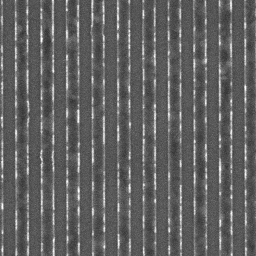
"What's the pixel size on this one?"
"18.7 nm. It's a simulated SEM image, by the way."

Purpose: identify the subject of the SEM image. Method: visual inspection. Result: parallel lines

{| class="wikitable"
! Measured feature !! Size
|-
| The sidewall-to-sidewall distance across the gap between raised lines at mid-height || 12.8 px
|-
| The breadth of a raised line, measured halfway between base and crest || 238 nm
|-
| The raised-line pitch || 475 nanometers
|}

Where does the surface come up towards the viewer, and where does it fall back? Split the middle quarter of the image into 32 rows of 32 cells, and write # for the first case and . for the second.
.###...###....##....###...###...
.###...###....##....###...###...
.###...###....##....###...###...
.###...###....##....###...###...
.###...###....##....###...###...
.###...###....##....###...###...
.###...###....##....###...###...
.###...###....##....#.#...###...
.###...###....##....###...###...
.###...###....##....###...###...
.###...###....##....###...###...
.###...###....##....###...###...
.###...###....##....###...###...
.#.#...###....##....###...###...
.###...###....##....###...###...
.###...###....##....###...###...
.###...###....##....###...###...
.###...###....##....###...###...
.###...###....##....###...###...
.###...###....##....###...###...
.###...###....###...###...###...
.###...###....###...###...###...
.###...###....##....###...###...
.###...###....##....###...###...
.###...###....##....###...###...
.###...###....##....###...###...
.###...###....##....###...###...
.###...###....##....###...###...
.###...###....##....###...###...
.###...###....##....###...###...
.###...###....##....###...###...
.###...###....##....###...###...